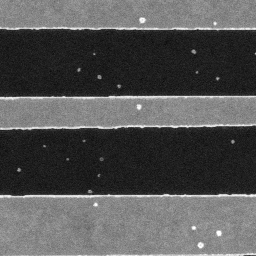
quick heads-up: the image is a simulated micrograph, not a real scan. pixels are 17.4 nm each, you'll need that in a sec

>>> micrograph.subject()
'lines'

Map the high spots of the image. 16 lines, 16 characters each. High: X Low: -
XXXXXXXXXXXXXXXX
XXXXXXXXXXXXXXXX
----------------
----------------
----------------
----------------
XXXXXXXXXXXXXXXX
XXXXXXXXXXXXXXXX
----------------
----------------
----------------
----------------
XXXXXXXXXXXXXXXX
XXXXXXXXXXXXXXXX
XXXXXXXXXXXXXXXX
XXXXXXXXXXXXXXXX